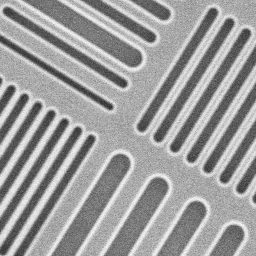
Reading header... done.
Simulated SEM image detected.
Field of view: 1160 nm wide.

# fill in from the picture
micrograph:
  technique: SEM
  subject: groups of lines, slits or small figures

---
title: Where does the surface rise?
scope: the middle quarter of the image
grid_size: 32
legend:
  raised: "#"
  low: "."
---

#####.....#####....########....#
#######.....###############...##
########.....#############....##
..########.....##########....##.
...#########....#########...###.
#....########...########....##..
###....#################...##...
####....###############...###...
######....############....##...#
########...###########...##....#
#########...#########....##...##
###########.########....##....##
####################...###...##.
###################....##...###.
.##################...##....##..
.##.##############...###...##...
##...#############...##...###...
##..##################....##...#
#...#...##############...##....#
...##...###############..##...##
...#...###################....##
..##...###################...##.
.##...#######...###############.
.#...#######.....#############..
##...######......##############.
#...######.......###############
#..#######.......###############
...######.......################
..######.......#######...#######
..######.......######.....######
.######.......######......######
#######.......######......######